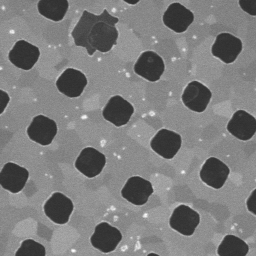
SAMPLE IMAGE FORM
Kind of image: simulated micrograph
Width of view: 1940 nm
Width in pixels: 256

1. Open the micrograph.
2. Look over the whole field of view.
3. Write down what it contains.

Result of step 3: a regular array of holes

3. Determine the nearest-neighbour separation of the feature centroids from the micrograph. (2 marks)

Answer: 0.42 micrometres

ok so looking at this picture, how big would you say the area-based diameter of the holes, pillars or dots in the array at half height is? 223 nanometers